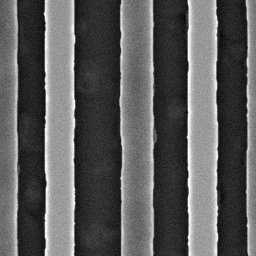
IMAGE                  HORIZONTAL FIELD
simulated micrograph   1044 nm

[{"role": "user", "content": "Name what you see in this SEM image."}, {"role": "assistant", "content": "lines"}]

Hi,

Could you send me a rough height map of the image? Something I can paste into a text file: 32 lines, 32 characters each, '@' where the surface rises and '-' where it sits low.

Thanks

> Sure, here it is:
@@----@@@------@@@@-----@@@----@
@@----@@@------@@@@-----@@@----@
@@----@@@------@@@@-----@@@----@
@@----@@@------@@@@-----@@@----@
@@----@@@------@@@@-----@@@----@
@@----@@@------@@@@-----@@@----@
@@----@@@------@@@@-----@@@----@
@@----@@@------@@@@-----@@@----@
@@----@@@------@@@@-----@@@----@
@@----@@@------@@@@-----@@@----@
@@----@@@------@@@@-----@@@----@
@@----@@@------@@@@-----@@@----@
@@----@@@------@@@@-----@@@----@
@@----@@@------@@@@-----@@@----@
@@----@@@------@@@@-----@@@----@
@@----@@@------@@@@-----@@@----@
@@----@@@------@@@@-----@@@----@
@@----@@@------@@@@-----@@@----@
@@----@@@------@@@@-----@@@----@
@@----@@@------@@@@-----@@@----@
@@----@@@------@@@@-----@@@----@
@@----@@@------@@@@-----@@@----@
@@----@@@------@@@@-----@@@----@
@@----@@@------@@@@-----@@@----@
@@----@@@------@@@@-----@@@----@
@@----@@@------@@@@-----@@@----@
@@----@@@------@@@@-----@@@----@
@@----@@@------@@@@-----@@@----@
@@----@@@------@@@@-----@@@----@
@@----@@@------@@@@-----@@@----@
@@----@@@------@@@@-----@@@----@
@@----@@@------@@@@-----@@@----@